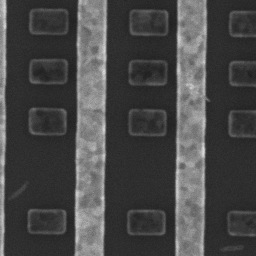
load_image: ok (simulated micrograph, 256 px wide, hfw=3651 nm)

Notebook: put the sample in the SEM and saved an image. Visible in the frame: wiring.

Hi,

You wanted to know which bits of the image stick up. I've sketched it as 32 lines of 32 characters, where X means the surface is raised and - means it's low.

X---------XXX---------XXXX------
X---XXXX--XXX----XXXX-XXXX---XXX
X---XXXX--XXX---XXXXX-XXXX---XXX
X---XXXX--XXX---XXXXX-XXXX---XXX
X---------XXX---------XXXX---XXX
X---------XXX---------XXXX------
X---------XXX---------XXXX------
X----XXX--XXX---------XXXX------
X---XXXX--XXX---XXXXX-XXXX---XXX
X---XXXX--XXX---XXXXX-XXXX---XXX
X---------XXX----XXX--XXXX---XXX
X---------XXX---------XXXX------
X---------XXX---------XXXX------
X---------XXX---------XXXX------
X---XXXX--XXX---XXXXX-XXXX---XXX
X---XXXX--XXX---XXXXX-XXXX---XXX
X---XXXX--XXX---XXXXX-XXXX---XXX
X---------XXX---------XXX-------
X---------XXX---------XXXX------
----------XXX---------XXXX------
----------XXX---------XXXX------
----------XXX---------XXXX------
----------XXX---------XXX-------
----------XXX---------XXXX------
----------XXX---------XXXX------
---------XXXX---------XXX-------
----XXXX-XXXX---XXXX--XXX----XXX
----XXXX-XXXX---XXXXX-XXX---XXXX
----XXXX-XXXX---XXXXX-XXX----XXX
----------XXX---------XXX-------
---------XXXX---------XXX-------
---------XXXX---------XXX-------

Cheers